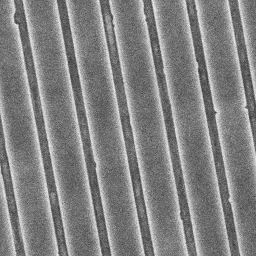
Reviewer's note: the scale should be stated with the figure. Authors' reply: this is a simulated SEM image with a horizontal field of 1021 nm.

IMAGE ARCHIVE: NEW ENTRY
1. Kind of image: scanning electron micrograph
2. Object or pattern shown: parallel lines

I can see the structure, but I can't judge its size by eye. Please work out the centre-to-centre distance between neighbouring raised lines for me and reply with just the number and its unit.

0.169 micrometres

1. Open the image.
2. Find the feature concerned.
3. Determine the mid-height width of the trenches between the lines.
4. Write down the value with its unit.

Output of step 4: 37.9 nm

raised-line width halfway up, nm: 132